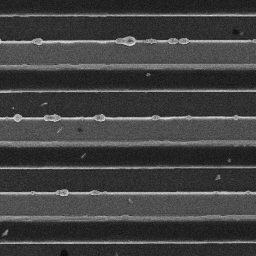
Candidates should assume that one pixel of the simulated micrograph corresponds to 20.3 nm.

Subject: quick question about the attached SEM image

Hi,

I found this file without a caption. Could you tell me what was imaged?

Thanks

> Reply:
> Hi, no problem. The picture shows lines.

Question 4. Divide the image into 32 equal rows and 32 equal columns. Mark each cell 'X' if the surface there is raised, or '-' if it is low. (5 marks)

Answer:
XXXXXXXXXXXXXXXXXXXXXXXXXXXXXXXX
XXXXXXXXXXXXXXXXXXXXXXXXXXXXXXXX
--------------------------------
--------------------------------
--------------------------------
XXXXXXXXXXXXXXXXXXXXXXXXXXXXXXXX
XXXXXXXXXXXXXXXXXXXXXXXXXXXXXXXX
XXXXXXXXXXXXXXXXXXXXXXXXXXXXXXXX
XXXXXXXXXXXXXXXXXXXXXXXXXXXXXXXX
XXXXXXXXXXXXXXXXXXXXXXXXXXXXXXXX
XXXXXXXXXXXXXXXXXXXXXXXXXXXXXXXX
--------------------------------
--------------------------------
--------------------------------
--X---X-----X-------------------
XXXXXXXXXXXXXXXXXXXXXXXXXXXXXXXX
XXXXXXXXXXXXXXXXXXXXXXXXXXXXXXXX
XXXXXXXXXXXXXXXXXXXXXXXXXXXXXXXX
XXXXXXXXXXXXXXXXXXXXXXXXXXXXXXXX
XXXXXXXXXXXXXXXXXXXXXXXXXXXXXXXX
XXXXXXXXXXXXXXXXXXXXXXXXXXXXXXXX
--------------------------------
--------------------------------
--------------------------------
XXXXXXXXXXXXXXXXXXXXXXXXXXXXXXXX
XXXXXXXXXXXXXXXXXXXXXXXXXXXXXXXX
XXXXXXXXXXXXXXXXXXXXXXXXXXXXXXXX
XXXXXXXXXXXXXXXXXXXXXXXXXXXXXXXX
XXXXXXXXXXXXXXXXXXXXXXXXXXXXXXXX
XXXXXXXXXXXXXXXXXXXXXXXXXXXXXXXX
--------------------------------
--------------------------------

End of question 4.